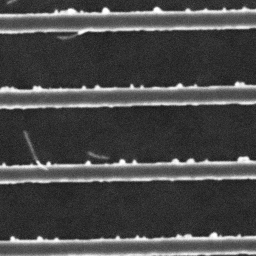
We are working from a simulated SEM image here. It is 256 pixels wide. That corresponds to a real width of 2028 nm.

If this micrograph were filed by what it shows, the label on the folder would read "lines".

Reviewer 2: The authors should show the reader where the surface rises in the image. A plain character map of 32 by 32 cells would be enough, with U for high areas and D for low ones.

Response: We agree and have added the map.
DDDDDDDDDDDDDDDDDDDDDDDDDDDDDDDD
DDDDDDDDDDDDDDDDDDDDDDDDDUUUUUUU
UUUUUUUUUUUUUUUUUUUUUUUUUUUUUUUU
UUUUUUUUUUUUUUUUUUUUUUUUUUUUUUUU
DDDDDDDDDDDDDDDDDDDDDDDDDDDDDDDD
DDDDDDDDDDDDDDDDDDDDDDDDDDDDDDDD
DDDDDDDDDDDDDDDDDDDDDDDDDDDDDDDD
DDDDDDDDDDDDDDDDDDDDDDDDDDDDDDDD
DDDDDDDDDDDDDDDDDDDDDDDDDDDDDDDD
DDDDDDDDDDDDDDDDDDDDDDDDDDDDDDDD
DDDDDDDDDDDDDDDDDDDDDDDDDDDDDDDD
UUUUUUUUUUUUUUUUUUUUUUUUUUUUUUUU
UUUUUUUUUUUUUUUUUUUUUUUUUUUUUUUU
UUUDDDDDDDDDDDDDDDDDDDDDDDDDDDDD
DDDDDDDDDDDDDDDDDDDDDDDDDDDDDDDD
DDDDDDDDDDDDDDDDDDDDDDDDDDDDDDDD
DDDDDDDDDDDDDDDDDDDDDDDDDDDDDDDD
DDDDDDDDDDDDDDDDDDDDDDDDDDDDDDDD
DDDDDDDDDDDDDDDDDDDDDDDDDDDDDDDD
DDDDDDDDDDDDDDDDDDDDDDDDDDDDDDDD
DDDDDDDDDDDDDDDDDDDUUUUUUUUUUUUU
UUUUUUUUUUUUUUUUUUUUUUUUUUUUUUUU
UUUUUUUUUUUUUUUUUUUDDUDDDDDDDDDD
DDDDDDDDDDDDDDDDDDDDDDDDDDDDDDDD
DDDDDDDDDDDDDDDDDDDDDDDDDDDDDDDD
DDDDDDDDDDDDDDDDDDDDDDDDDDDDDDDD
DDDDDDDDDDDDDDDDDDDDDDDDDDDDDDDD
DDDDDDDDDDDDDDDDDDDDDDDDDDDDDDDD
DDDDDDDDDDDDDDDDDDDDDDDDDDDDDDDD
DDDDDDDDDDDDDDDDDDDDDDDDDDDDDDDD
UUUUUUUUUUUUUUUUUUUUUUUUUUUUUUUU
UUUUUUUUUUUUUUUUUUUUUUUUUUUUUUUU